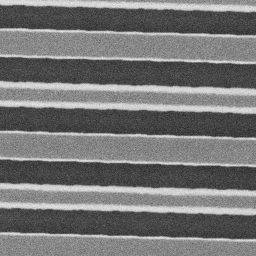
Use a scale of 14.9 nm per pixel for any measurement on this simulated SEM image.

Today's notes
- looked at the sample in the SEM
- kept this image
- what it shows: lines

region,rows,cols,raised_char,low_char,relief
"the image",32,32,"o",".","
.......ooooooooooooooooooooooooo
................................
................................
................................
ooooooooooooooooooooooooooooo...
oooooooooooooooooooooooooooooooo
oooooooooooooooooooooooooooooooo
...................ooooooooooooo
................................
................................
oo..............................
oooooooooooooooooooooooooooooooo
oooooooooooooooooooooooooooooooo
..................oooooooooooooo
................................
................................
ooo.............................
oooooooooooooooooooooooooooooooo
oooooooooooooooooooooooooooooooo
oooooooooooooooooooooooooooooooo
........................oooooooo
................................
................................
ooooooooooooo...................
oooooooooooooooooooooooooooooooo
oooooooooooooooooooooooooooooooo
.............................ooo
................................
................................
oooooooooooooo..................
oooooooooooooooooooooooooooooooo
oooooooooooooooooooooooooooooooo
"